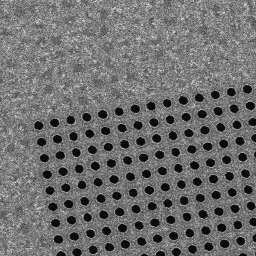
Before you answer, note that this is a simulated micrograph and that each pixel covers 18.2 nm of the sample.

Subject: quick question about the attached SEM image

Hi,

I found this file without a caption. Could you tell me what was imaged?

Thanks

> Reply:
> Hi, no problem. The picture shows a regular array of holes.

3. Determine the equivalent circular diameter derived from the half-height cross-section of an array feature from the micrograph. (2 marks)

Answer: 163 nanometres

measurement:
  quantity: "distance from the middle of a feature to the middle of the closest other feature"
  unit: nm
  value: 295